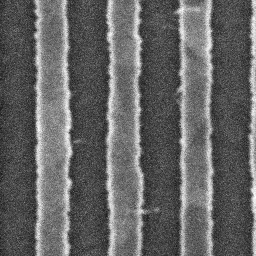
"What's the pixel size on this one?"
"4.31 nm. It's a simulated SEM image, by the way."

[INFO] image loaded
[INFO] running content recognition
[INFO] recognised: one or a few lines or trenches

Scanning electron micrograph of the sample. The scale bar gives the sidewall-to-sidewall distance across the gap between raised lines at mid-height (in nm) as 181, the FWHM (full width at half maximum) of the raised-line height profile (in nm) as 128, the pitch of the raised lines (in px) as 71.7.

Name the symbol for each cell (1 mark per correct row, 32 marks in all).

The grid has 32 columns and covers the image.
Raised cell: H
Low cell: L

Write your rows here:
LLLLLHHHLLLLLLHHHLLLLLLHHHLLLLLL
LLLLLHHHLLLLLLHHHLLLLLHHHHLLLLLL
LLLLLHHHLLLLLLHHHLLLLLHHHHLLLLLL
LLLLLHHHLLLLLLHHHLLLLLLHHHLLLLLL
LLLLLHHHLLLLLLHHLLLLLLLHHHLLLLLL
LLLLLHHHLLLLLLHHHLLLLLLHHHLLLLLL
LLLLLHHHLLLLLLHHHLLLLLLHHHLLLLLL
LLLLLHHHLLLLLLHHHLLLLLLHHHLLLLLL
LLLLLHHHLLLLLLHHHLLLLLLHHHLLLLLL
LLLLLHHHLLLLLLHHHLLLLLLHHHLLLLLH
LLLLLHHHLLLLLLHHHLLLLLLHHHLLLLLH
LLLLLHHHHLLLLLHHHLLLLLLHHHLLLLLL
LLLLLHHHHLLLLLHHHLLLLLLHHHLLLLLL
LLLLLHHHLLLLLLHHHLLLLLLHHHLLLLLL
LLLLLHHHHLLLLLHHHLLLLLLHHHLLLLLL
LLLLLHHHHLLLLLHHHLLLLLLHHHLLLLLL
LLLLLHHHLLLLLLHHHLLLLLLHHHLLLLLL
LLLLLHHHHLLLLHHHHLLLLLLHHHLLLLLH
LLLLLHHHHLLLLLHHHLLLLLLHHHLLLLLH
LLLLLHHHHLLLLHHHHLLLLLLHHHLLLLLH
LLLLLHHHLLLLLHHHHLLLLLLHHHLLLLLH
LLLLLHHHLLLLLHHHHHLLLLLHHHHLLLLL
LLLLLHHHHLLLLLHHHHLLLLLHHHLLLLLL
LLLLLHHHHLLLLLHHHHLLLLLHHHLLLLLL
LLLLLHHHLLLLLLHHHHLLLLLHHHLLLLLL
LLLLLHHHHLLLLLHHHHLLLLLHHHLLLLLL
LLLLLHHHLLLLLLHHHHLLLLLHHHLLLLLL
LLLLLHHHHLLLLLHHHHLLLLLHHHLLLLLL
LLLLLHHHLLLLLLHHHLLLLLLHHHLLLLLL
LLLLLHHHLLLLLLHHHLLLLLLHHHLLLLLL
LLLLLHHHLLLLLLHHHHLLLLLHHHLLLLLL
LLLLLHHHLLLLLLHHHLLLLLLHHHLLLLLL